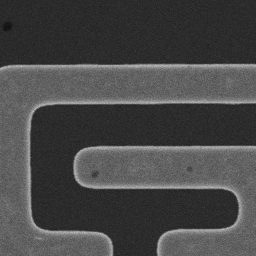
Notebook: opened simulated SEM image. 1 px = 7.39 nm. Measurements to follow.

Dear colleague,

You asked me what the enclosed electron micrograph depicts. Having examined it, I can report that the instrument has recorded wiring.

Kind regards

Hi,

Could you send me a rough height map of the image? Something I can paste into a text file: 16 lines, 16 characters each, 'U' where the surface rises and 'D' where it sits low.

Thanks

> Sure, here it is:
DDDDDDDDDDDDDDDD
DDDDDDDDDDDDDDDD
DDDDDDDDDDDDDDDD
DDDDDDDDDDDDDDDD
UUUUUUUUUUUUUUUU
UUUUUUUUUUUUUUUU
UUUDDDDDDDDDDDDD
UUDDDDDDDDDDDDDD
UUDDDDDDDDDDDDDD
UUDDDUUUUUUUUUUU
UUDDDUUUUUUUUUUU
UUDDDUUUUUUUUUUU
UUDDDDDDDDDDDDDU
UUDDDDDDDDDDDDDU
UUUDDDDDDDDUUUUU
UUUUUUUDDDUUUUUU